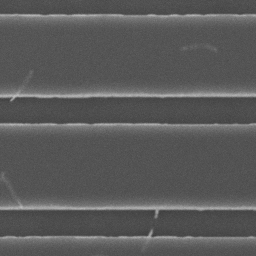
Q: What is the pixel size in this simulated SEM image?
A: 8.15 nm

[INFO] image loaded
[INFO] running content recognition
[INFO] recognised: lines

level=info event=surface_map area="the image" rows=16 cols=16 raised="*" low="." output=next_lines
................
****************
****************
****************
****************
****************
................
................
****************
****************
****************
****************
****************
................
................
****************